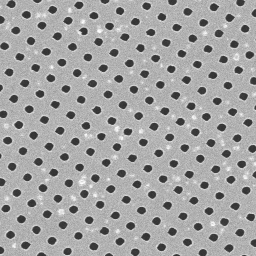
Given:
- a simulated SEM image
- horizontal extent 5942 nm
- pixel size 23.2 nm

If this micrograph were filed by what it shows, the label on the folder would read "a regular array of holes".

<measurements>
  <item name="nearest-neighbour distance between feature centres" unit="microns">0.43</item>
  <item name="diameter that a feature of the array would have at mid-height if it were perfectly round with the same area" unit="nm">194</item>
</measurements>